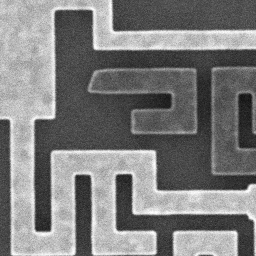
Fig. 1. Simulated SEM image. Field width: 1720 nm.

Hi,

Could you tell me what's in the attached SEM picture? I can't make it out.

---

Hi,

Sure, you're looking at wiring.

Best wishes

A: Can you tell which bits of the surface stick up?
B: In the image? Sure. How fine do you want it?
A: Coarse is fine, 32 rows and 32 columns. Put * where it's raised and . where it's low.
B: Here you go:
**************..................
*******.....**..................
*******.....**..................
*******.....**..................
*******.....********************
*******.....********************
*******.........................
*******.........................
*******.....................****
*******.....************...*****
*******....*************...*****
*******.....************...*****
*******...............**...***..
*******..............***...***..
*******..........********..***..
.***.............********..***..
.***.............*******...***..
.***.......................***..
.***.......................***..
.***...************........*****
..**...************........*****
..**...************........*****
..**...**...**...**.............
..**...**...**...***...........*
..**...**...**...***************
..**...**...**...***************
..**...**...**...***************
..**...**...**..................
..**..***...**..................
..*******...*******...********..
..*******...*******...********..
..*******...*******...********..